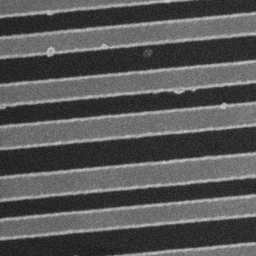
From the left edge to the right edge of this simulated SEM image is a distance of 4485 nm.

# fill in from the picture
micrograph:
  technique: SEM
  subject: lines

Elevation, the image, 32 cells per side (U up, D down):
UUUUUUUUUUUUUUUUUDDDDDDDDDDDDDDD
UUUUUUDDDDDDDDDDDDDDDDDDDDDDDDDD
DDDDDDDDDDDDDDDDDDDDDDDDUUUUUUUU
DDDDDDDDDDDDDUUUUUUUUUUUUUUUUUUU
DDDUUUUUUUUUUUUUUUUUUUUUUUUUUDDD
UUUUUUUUUUUUUUUUUUDDDDDDDDDDDDDD
UUUUUUUUDDDDDDDDDDDDDDDDDDDDDDDD
DDDDDDDDDDDDDDDDDDDDDDDDDDDDDDDD
DDDDDDDDDDDDDDDDDDDDDDDUUUUUUUUU
DDDDDDDDDDDDUUUUUUUUUUUUUUUUUUUU
DDUUUUUUUUUUUUUUUUUUUUUUUUUUDDDD
UUUUUUUUUUUUUUUUUUDDDDUDDDDDDDDD
UUUUUUUDDDDDDDDDDDDDDDDDDDDDDDDD
DDDDDDDDDDDDDDDDDDDDDDDDDUUUUUUU
DDDDDDDDDDDDDDUUUUUUUUUUUUUUUUUU
DDDDUUUUUUUUUUUUUUUUUUUUUUUUUUUU
UUUUUUUUUUUUUUUUUUUUUUDDDDDDDDDD
UUUUUUUUUUUUDDDDDDDDDDDDDDDDDDDD
UDDDDDDDDDDDDDDDDDDDDDDDDDDDDDDD
DDDDDDDDDDDDDDDDDDDDDDDDDDDDDUUU
DDDDDDDDDDDDDDDDDDUUUUUUUUUUUUUU
DDDDDDDDUUUUUUUUUUUUUUUUUUUUUUUU
UUUUUUUUUUUUUUUUUUUUUUUUUUUDDDDD
UUUUUUUUUUUUUUUUUDDDDDDDDDDDDDDD
UUUUUUDDDDDDDDDDDDDDDDDDDDDDDDDU
DDDDDDDDDDDDDDDDDDDDDDUUUUUUUUUU
DDDDDDDDDDDUUUUUUUUUUUUUUUUUUUUU
UUUUUUUUUUUUUUUUUUUUUUUUUDDDDDDD
UUUUUUUUUUUUUUDDDDDDDDDDDDDDDDDD
UUUUDDDDDDDDDDDDDDDDDDDDDDDDDDDD
DDDDDDDDDDDDDDDDDDDDDDDDDDDDDDDD
DDDDDDDDDDDDDDDDDDDDUUUUUUUUUUUU